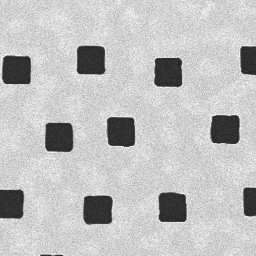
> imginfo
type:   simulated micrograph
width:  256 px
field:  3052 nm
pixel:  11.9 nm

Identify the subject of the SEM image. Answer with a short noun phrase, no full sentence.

a regular array of holes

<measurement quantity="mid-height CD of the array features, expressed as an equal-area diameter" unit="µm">0.373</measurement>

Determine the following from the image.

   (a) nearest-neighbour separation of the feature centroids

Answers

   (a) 0.892 um